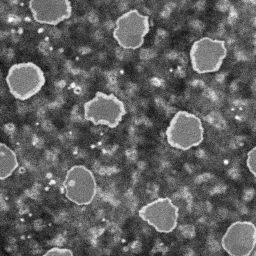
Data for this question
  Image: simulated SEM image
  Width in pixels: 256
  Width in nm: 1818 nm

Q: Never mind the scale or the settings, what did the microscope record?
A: raised bodies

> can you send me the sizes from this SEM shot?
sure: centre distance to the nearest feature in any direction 563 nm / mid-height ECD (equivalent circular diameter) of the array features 34.8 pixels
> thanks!